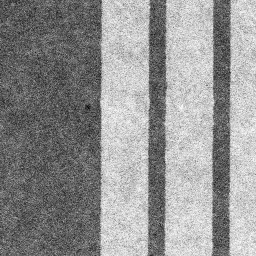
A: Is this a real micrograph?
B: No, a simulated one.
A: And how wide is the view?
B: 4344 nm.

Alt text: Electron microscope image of one or a few lines or trenches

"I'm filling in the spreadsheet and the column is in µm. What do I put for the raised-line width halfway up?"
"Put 0.787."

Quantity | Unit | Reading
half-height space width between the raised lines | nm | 299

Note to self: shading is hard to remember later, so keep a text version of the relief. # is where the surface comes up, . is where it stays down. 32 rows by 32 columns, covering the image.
.............######..######..###
.............######..######..###
.............######..######..###
.............#####...######..###
.............#####...######..###
.............#####...######..###
.............######..######..###
.............######..######..###
.............######..######..###
.............######..######..###
.............######..######..###
.............######..######..###
.............######..######..###
.............######..######..###
.............######..######..###
.............#####...######..###
.............#####...#####...###
.............#####...#####...###
.............#####...#####...###
.............#####...#####...###
.............#####...#####...###
.............#####...#####...###
.............#####...#####...###
.............#####...#####...###
.............######..#####...###
.............#####...#####...###
.............#####...#####...###
.............#####...#####...###
.............#####...#####...###
.............#####...#####...###
.............#####...#####...###
.............#####...#####...###